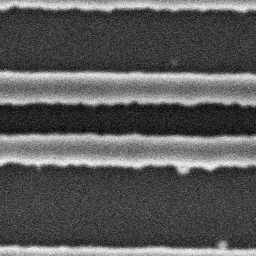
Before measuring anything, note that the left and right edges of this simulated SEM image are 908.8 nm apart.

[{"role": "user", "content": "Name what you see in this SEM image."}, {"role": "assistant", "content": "lines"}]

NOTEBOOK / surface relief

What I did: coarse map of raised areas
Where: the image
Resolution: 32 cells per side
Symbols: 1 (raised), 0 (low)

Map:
11111111111111111111111111111111
00000000000000000000000000000000
00000000000000000000000000000000
00000000000000000000000000000000
00000000000000000000000000000000
00000000000000000000000000000000
00000000000000000000000000000000
00000000000000000000000000000000
00000000000000000000000000000000
11111111111111111111111111111111
11111111111111111111111111111111
11111111111111111111111111111111
11111111111111111111111111111111
00000000000000000000000000000000
00000000000000000000000000000000
00000000000000000000000000000000
00000000000000000000000000000000
11111111111111111111111111111111
11111111111111111111111111111111
11111111111111111111111111111111
00001001000111111101111111111111
00000000000000000000000000000000
00000000000000000000000000000000
00000000000000000000000000000000
00000000000000000000000000000000
00000000000000000000000000000000
00000000000000000000000000000000
00000000000000000000000000000000
00000000000000000000000000000000
00000000000000000000000000000000
00000000000000000000000000000000
11111111111111111111111111111111